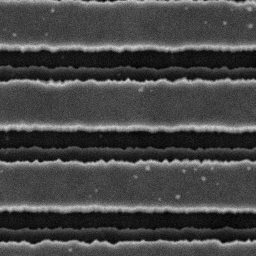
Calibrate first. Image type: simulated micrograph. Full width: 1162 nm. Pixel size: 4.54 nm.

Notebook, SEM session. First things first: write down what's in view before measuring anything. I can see lines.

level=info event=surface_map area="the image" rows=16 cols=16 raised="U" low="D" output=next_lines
UUUUUUUUUUUUUUUU
UUUUUUUUUUUUUUUU
UUUUUUUUUUUUUUUU
DDDDDDDDDDDDDDDD
DDDDDDDDDDDDDDDD
UUUUUUUUUUUUUUUU
UUUUUUUUUUUUUUUU
UUUUUUUUUUUUUUUU
DDDDDDDDDDDDDDDD
DDDDDDDDDDDDDDDD
UUUUUUUUUUUUUUUU
UUUUUUUUUUUUUUUU
UUUUUUUUUUUUUUUU
DDDDDDDDDDDDDDDD
DDDDDDDDDDDDDDDD
UUUUUUUUUUUUUUUU